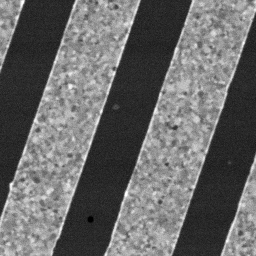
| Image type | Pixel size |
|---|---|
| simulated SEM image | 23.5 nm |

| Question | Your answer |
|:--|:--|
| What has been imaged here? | one or a few lines or trenches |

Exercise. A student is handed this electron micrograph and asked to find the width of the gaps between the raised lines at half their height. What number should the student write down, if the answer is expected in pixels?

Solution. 50.1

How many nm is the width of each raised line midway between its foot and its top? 1440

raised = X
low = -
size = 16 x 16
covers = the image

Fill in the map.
X----XXXX---XXXX
X---XXXX----XXXX
X---XXXX---XXXX-
----XXXX---XXXX-
---XXXX----XXXX-
---XXXX---XXXX--
---XXX----XXXX--
--XXXX---XXXXX--
--XXXX---XXXX---
-XXXX----XXXX---
-XXXX---XXXXX---
-XXXX---XXXX---X
XXXX----XXXX---X
XXXX---XXXXX---X
XXXX---XXXX---XX
XXX----XXXX---XX